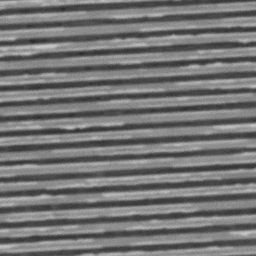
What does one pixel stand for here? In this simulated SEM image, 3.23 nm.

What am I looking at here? parallel lines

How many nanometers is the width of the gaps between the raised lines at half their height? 21.4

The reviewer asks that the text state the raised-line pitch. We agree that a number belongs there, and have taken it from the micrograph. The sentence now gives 49.1 nanometres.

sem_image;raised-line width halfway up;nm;27.8